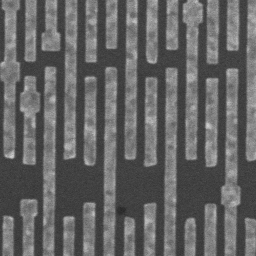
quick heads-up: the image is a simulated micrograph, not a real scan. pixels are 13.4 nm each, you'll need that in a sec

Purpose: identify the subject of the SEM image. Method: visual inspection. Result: wiring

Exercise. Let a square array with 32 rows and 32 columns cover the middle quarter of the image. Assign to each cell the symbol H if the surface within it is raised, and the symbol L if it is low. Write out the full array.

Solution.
LHHLLLLLLLLLLLLLHHLLLLLLLLLLLLLH
LHHLLLLLLLHHHLLLHHLLLLLLLLHHLLLH
LHHLLLLLLLHHHLLLHHLLLLLLLLHHLLLH
LHHLLLHHLLHHHLLLHHLLLLLLLLHHLLLH
LHHLLHHHLLHHHLLLHHLLLHHLLLHHLLLH
LHHLLHHHLLHHHLLLHHLLLHHLLLHHLLLH
HHHLLHHHLLHHHLLLHHLLLHHLLLHHLLLH
HHHLLHHHLLHHHLLLHHLLLHHLLLHHLLLH
HHHLLHHHLLHHHLLLHHLLHHHLLLHHLLLH
HHHLLHHHLLHHHLLLHHLLHHHLLLHHLLLH
HHHLLHHHLLHHHLLLHHLLHHHLLLHHLLLH
HHHLLHHHLLHHHLLLHHLLHHHLLLHHLLLH
HHHLLHHHLLHHHLLLHHLLHHHLLLHHLLLH
HHHLLHHHLLHHHLLHHHLLHHHLLLHHLLLH
HHHLLHHHLLHHHLLHHHLLHHHLLLHHLLLH
HHHLLHHHLLHHHLLHHHLLHHHLLLHHLLLH
HHHLLHHHLLHHHLLHHHLLHHHLLLHHLLLH
HHHLLHHHLLHHHLLHHHLLHHHLLLHHLLLH
HHHLLHHHLLHHHLLHHHLLHHHLLLHHLLLH
HHHLLHHHLLHHHLLHHHLLHHHLLLHHLLLH
HHHLLHHHLLHHHLLHHHLLHHHLLLHHLLLH
HHHLLHHHLLHHHLLHHHLLHHHLLLHHLLLH
HHHLLHHHLLHHHLLHHHLLHHHLLLHHLLLH
HLLLLHHHLLHHHLLLHLLLHHHLLLHHLLLH
LLLLLHHHLLHHHLLLLLLLHHHLLLHHLLLL
LLLLLLLLLLHHHLLLLLLLLLLLLLHHLLLL
LLLLLLLLLLHHHLLLLLLLLLLLLLHHLLLL
LLLLLLLLLLHHHLLLLLLLLLLLLHHHLLLL
LLLLLLLLLLHHHLLLLLLLLLLLLHHHLLLL
LLLLLLLLLLHHHLLLLLLLLLLLLHHHLLLL
LLLLLLLLLLHHHLLLLLLLLLLLLHHHLLLL
LLLLLLLLLLHHHLLLLLLLLLLLLHHHLLLL